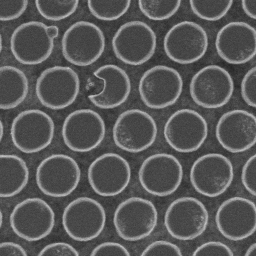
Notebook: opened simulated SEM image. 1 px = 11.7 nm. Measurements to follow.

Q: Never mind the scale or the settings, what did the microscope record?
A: a regular array of raised bodies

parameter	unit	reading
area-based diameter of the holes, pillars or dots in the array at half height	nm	475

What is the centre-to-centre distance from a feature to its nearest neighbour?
592 nanometers